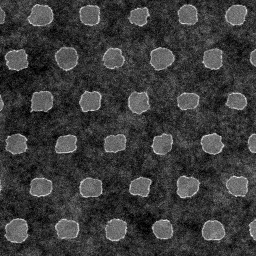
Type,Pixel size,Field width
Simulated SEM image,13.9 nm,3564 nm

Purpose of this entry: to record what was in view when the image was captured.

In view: a regular array of raised bodies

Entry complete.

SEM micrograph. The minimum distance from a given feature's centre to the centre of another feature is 0.674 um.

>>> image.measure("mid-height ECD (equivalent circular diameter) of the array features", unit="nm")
290